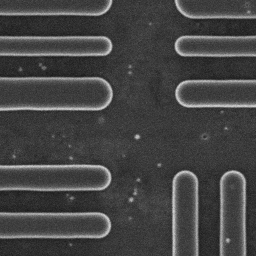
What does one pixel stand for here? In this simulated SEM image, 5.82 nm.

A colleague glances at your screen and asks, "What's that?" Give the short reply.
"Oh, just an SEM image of groups of lines, slits or small figures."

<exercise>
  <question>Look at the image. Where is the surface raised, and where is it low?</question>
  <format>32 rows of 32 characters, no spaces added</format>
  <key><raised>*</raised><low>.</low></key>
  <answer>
**************........**********
*************..........*********
................................
................................
................................
**************........**********
**************........**********
................................
................................
................................
*************..........*********
**************........**********
**************........**********
*************...................
................................
................................
................................
................................
................................
................................
................................
*************..........*.....*..
**************........***...***.
*************.........***...***.
......................***...***.
......................***...***.
......................***...**..
**************........***...**..
**************........***...***.
*************.........***...***.
......................***...***.
......................***...***.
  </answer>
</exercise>